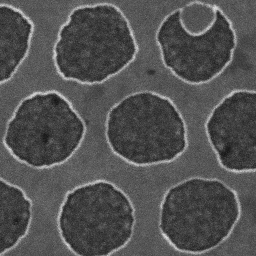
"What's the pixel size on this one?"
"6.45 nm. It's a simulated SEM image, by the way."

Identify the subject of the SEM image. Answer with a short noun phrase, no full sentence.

holes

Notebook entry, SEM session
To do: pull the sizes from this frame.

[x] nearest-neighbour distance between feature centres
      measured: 640 nanometres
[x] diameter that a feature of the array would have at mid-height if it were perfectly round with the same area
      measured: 478 nm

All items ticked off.